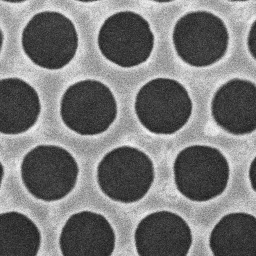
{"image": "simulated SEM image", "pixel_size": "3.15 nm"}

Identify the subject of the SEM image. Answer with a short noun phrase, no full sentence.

a regular array of holes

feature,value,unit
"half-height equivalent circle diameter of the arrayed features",0.178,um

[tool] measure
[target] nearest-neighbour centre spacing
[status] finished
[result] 236 nm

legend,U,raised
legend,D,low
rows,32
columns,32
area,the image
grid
UUUUUUUUUUUUUUUUUUUUUUUUUUUUUUUU
UUUUUDDUUUUUUUUDDUUUUUUUDDUUUUUU
UUUUDDDDDUUUUDDDDDUUUUDDDDDDUUUU
UUUDDDDDDUUUUDDDDDDUUUDDDDDDUUUD
UUUDDDDDDDUUDDDDDDDUUUDDDDDDDUUD
UUUDDDDDDDUUDDDDDDDUUUDDDDDDDUUD
UUUDDDDDDUUUUDDDDDDUUUDDDDDDUUUD
UUUUDDDDDUUUUUDDDDUUUUUDDDDUUUUU
UUUUUUDDUUUUUUUUUUUUUUUUUUUUUUUU
UUUUUUUUUUUUUUUUUUUUUUUUUUUUUUUU
DDDUUUUUUDDDDUUUUUDDDDDUUUUUDDDD
DDDDUUUUDDDDDDUUUDDDDDDUUUUDDDDD
DDDDDUUUDDDDDDUUUDDDDDDDUUUDDDDD
DDDDDUUUDDDDDDDUUDDDDDDDUUDDDDDD
DDDDDUUUDDDDDDDUUDDDDDDDUUUDDDDD
DDDDUUUUDDDDDDUUUUDDDDDUUUUDDDDD
DDDUUUUUUDDDDUUUUUUDDDUUUUUUUDDU
UUUUUUUUUUUUUUUUUUUUUUUUUUUUUUUU
UUUUDDDDUUUUUUUDDUUUUUUDDDDUUUUU
UUUDDDDDDUUUUDDDDDUUUUDDDDDDUUUU
UUUDDDDDDDUUDDDDDDDUUUDDDDDDUUUD
UUUDDDDDDDUUDDDDDDDUUUDDDDDDDUUD
UUUDDDDDDDUUDDDDDDDUUUDDDDDDDUUD
UUUDDDDDDUUUUDDDDDDUUUDDDDDDUUUU
UUUUDDDDUUUUUDDDDDUUUUUDDDDUUUUU
UUUUUUUUUUUUUUUUUUUUUUUUUUUUUUUU
UUUUUUUUUUDUUUUUUUUDDUUUUUUUUUUU
DDDDUUUUDDDDDUUUUUDDDDDUUUUUDDDD
DDDDDUUUDDDDDDUUUDDDDDDDUUUDDDDD
DDDDDUUUDDDDDDUUUDDDDDDDUUDDDDDD
DDDDDUUDDDDDDDUUUDDDDDDDUUDDDDDD
DDDDDUUUDDDDDDUUUDDDDDDUUUUDDDDD